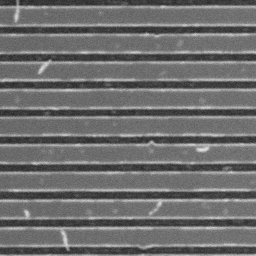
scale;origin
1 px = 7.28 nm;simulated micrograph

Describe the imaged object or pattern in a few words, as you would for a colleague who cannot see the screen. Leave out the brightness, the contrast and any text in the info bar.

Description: parallel lines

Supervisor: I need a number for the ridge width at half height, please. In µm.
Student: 0.138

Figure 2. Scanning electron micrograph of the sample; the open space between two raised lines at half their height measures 63.7 nm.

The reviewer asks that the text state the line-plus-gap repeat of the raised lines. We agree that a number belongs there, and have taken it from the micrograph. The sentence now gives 27.6 pixels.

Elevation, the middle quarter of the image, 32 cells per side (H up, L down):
HHHHHHHHHHHHHHHHHHHHHHHHHHHHHHHH
HHHHHHHHHHHHHHHHHHHHHHHHHHHHHHHH
HHHHHHHHHHHHHHHHHHHHHHHHHHHHHHHH
HHHHHHHHHHHHHHHHHHHHHHHHHHHHHHHH
LLLLLLLLLLLLLLLLLLLLLLLLLLLLLLLL
LLLLLLLLLLLLLLLLLLLLLLLLLLLLLLLL
HHHLLLLLHHHHHHLLLHHHHHLLHLHLLLLL
HHHHHHHHHHHHHHHHHHHHHHHHHHHHHHHH
HHHHHHHHHHHHHHHHHHHHHHHHHHHHHHHH
HHHHHHHHHHHHHHHHHHHHHHHHHHHHHHHH
HHHHHHHHHHHHHHHHHHHHHHHHHHHHHHHH
LLLLLLLLLLLLLLLLLLLLLLLLLLLLLLLL
LLLLLLLLLLLLLLLLLLLLLLLLLLLLLLLL
HHHHHHHHHHHHHHHHHHHHHHHHHHHHHHHH
HHHHHHHHHHHHHHHHHHHHHHHHHHHHHHHH
HHHHHHHHHHHHHHHHHHHHHHHHHHHHHHHH
HHHHHHHHHHHHHHHHHHHHHHHHHHHHHHHH
HHHHHHHHHHHHHHHHHHHHHHHHHHHHHHHH
LLLLLLLLLLLLLLLLLLLLLLLLLLLLLLLL
LLLLLLLLLLLLLLLLLLLLLLLLLLLLLLLL
HHHHHHHHHHHHHHHHHHHHHHHHHHHHHHHH
HHHHHHHHHHHHHHHHHHHHHHHHHHHHHHHH
HHHHHHHHHHHHHHHHHHHHHHHHHHHHHHHH
HHHHHHHHHHHHHHHHHHHHHHHHHHHHHHHH
HHHHHHHHHHHHHHHHHHHHHHHHHHHHHHHH
LLLLLLLLLLLLLLLLLLLLLLLLLLLLLLLL
LLLLLLLLLLLLLLLLLLLLLLLLLLLLLLLL
HHHHHHHHHHHHHHHHHHHHHHHHHHHHHHHH
HHHHHHHHHHHHHHHHHHHHHHHHHHHHHHHH
HHHHHHHHHHHHHHHHHHHHHHHHHHHHHHHH
HHHHHHHHHHHHHHHHHHHHHHHHHHHHHHHH
HHHHHHHHHHHHHHHHHHHHHHHHHHHHLLLL